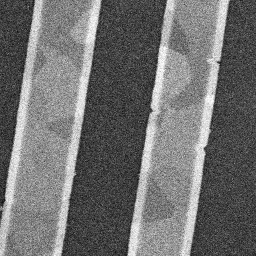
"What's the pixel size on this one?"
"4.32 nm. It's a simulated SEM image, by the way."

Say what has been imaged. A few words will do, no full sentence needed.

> one or a few lines or trenches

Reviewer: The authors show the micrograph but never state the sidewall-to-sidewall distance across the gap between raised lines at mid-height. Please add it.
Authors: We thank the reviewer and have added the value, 319 nm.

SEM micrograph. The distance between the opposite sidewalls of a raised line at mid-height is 236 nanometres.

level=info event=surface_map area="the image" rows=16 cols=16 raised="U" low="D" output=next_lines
DDUUUUDDDDDUUUDD
DDUUUUDDDDDUUUDD
DDUUUUDDDDUUUUDD
DDUUUUDDDDUUUUDD
DDUUUDDDDDUUUDDD
DDUUUDDDDDUUUDDD
DUUUUDDDDDUUUDDD
DUUUUDDDDDUUUDDD
DUUUUDDDDUUUUDDD
DUUUUDDDDUUUDDDD
DUUUDDDDDUUUDDDD
DUUUDDDDDUUUDDDD
DUUUDDDDDUUUDDDD
UUUUDDDDDUUUDDDD
UUUUDDDDUUUUDDDD
UUUUDDDDUUUUDDDD